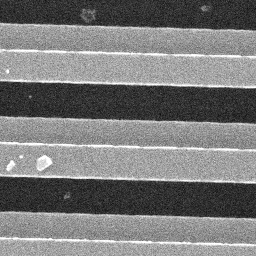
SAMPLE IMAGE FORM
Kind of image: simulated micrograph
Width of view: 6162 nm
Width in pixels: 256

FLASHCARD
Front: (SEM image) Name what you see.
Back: lines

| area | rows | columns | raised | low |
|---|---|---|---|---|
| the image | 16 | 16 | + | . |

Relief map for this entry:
................
+...............
++++++++++++++++
++++++++++++++++
++++++++++++++++
................
................
+++++++.........
++++++++++++++++
++++++++++++++++
++++++++++++++++
................
................
+++++++.........
++++++++++++++++
++++++++++++++++